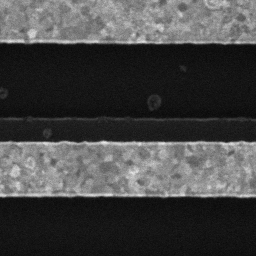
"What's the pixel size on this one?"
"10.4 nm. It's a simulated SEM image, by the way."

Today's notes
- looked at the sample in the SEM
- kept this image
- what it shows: lines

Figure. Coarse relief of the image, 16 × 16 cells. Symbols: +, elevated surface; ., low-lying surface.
++++++++++++++++
++++++++++++++++
++++++++++++++++
................
................
................
................
................
................
++++++++++++++++
++++++++++++++++
++++++++++++++++
................
................
................
................